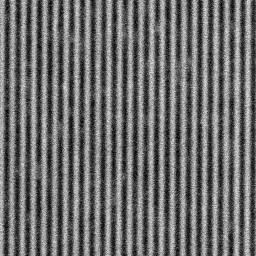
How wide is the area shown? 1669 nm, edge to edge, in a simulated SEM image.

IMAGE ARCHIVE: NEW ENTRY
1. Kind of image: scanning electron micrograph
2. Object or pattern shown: parallel lines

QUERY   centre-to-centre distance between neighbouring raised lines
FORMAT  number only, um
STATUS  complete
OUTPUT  0.0698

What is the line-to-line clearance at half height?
0.0456 micrometres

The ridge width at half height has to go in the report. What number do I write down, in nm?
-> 22.8